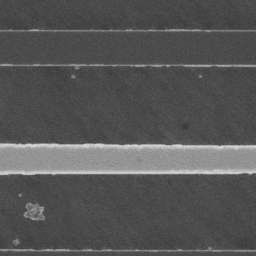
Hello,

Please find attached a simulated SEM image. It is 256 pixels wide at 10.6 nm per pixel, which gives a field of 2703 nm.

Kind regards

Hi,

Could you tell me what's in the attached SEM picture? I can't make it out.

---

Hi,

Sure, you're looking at lines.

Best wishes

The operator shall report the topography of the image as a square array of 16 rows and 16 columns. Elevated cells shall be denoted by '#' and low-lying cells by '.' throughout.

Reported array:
................
................
################
################
................
................
................
................
................
################
################
................
................
................
................
................